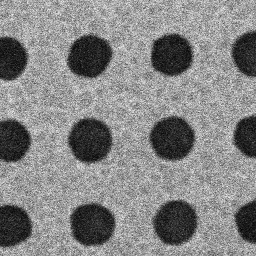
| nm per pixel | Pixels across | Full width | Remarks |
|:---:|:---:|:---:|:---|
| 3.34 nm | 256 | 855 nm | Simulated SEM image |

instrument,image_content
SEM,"holes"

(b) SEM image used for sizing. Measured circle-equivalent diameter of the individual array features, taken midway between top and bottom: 0.146 microns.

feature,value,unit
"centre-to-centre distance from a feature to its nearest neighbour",0.275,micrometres